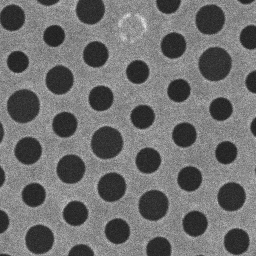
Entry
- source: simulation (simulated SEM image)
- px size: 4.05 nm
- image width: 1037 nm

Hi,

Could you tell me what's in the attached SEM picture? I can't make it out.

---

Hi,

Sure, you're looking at a regular array of holes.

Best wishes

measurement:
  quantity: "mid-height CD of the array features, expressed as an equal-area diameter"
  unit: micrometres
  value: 0.103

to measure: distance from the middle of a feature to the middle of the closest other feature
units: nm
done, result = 180